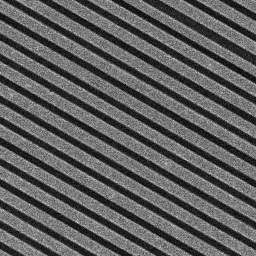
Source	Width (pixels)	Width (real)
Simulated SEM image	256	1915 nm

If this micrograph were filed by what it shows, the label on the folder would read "parallel lines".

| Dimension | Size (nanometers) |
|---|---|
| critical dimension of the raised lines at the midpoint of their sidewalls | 83.4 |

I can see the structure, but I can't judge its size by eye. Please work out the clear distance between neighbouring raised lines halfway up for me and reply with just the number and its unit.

48.6 nanometers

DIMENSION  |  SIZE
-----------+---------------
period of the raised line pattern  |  135 nm